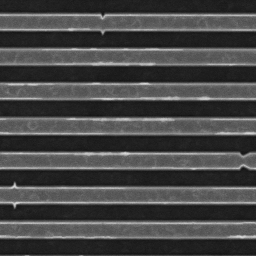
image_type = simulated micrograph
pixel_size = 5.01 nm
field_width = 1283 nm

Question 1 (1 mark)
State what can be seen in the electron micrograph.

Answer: parallel lines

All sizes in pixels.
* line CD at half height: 17.3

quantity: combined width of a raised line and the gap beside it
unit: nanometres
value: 173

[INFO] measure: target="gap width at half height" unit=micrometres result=0.0858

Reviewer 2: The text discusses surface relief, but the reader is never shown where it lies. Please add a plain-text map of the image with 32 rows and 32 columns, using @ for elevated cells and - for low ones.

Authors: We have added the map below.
--------------------------------
--------------------------------
@@@@@@@@@@@@@@@@@@@@@@@@@@@@@@@@
@@@@@@@@@@@@@@@@@@@@@@@@@@@@@@@@
--------------------------------
--------------------------------
@@@@@@@@@@@@@@@@@@@@@@@@@@@@@@@@
@@@@@@@@@@@@@@@@@@@@@@@@@@@@@@@@
--------------------------------
--------------------------------
@@@@@@@@@@@@@@@@@@@@@@@@@@@@@@@@
@@@@@@@@@@@@@@@@@@@@@@@@@@@@@@@@
-------@--------@-@@-@@@@-------
--------------------------------
--------------------------------
@@@@@@@@@@@@@@@@@@@@@@@@@@@@@@@@
@@@@@@@@@@@@@@@@@@@@@@@@@@@@@@@@
--------------------------------
--------------------------------
@@@@@@@@@@@@@@@@@@@@@@@@@@@@@@@@
@@@@@@@@@@@@@@@@@@@@@@@@@@@@@@@@
--------------------------------
--------------------------------
@@@@@@@@@@@@@@@@@@@@@@@@@@@@@@@@
@@@@@@@@@@@@@@@@@@@@@@@@@@@@@@@@
-@-@----------------------------
--------------------------------
--------------------------------
@@@@@@@@@@@@@@@@@@@@@@@@@@@@@@@@
@@@@@@@@@@@@@@@@@@@@@@@@@@@@@@@@
--------------------------------
--------------------------------